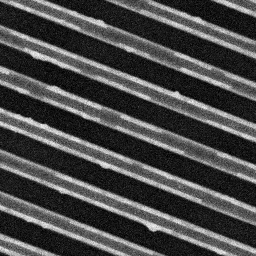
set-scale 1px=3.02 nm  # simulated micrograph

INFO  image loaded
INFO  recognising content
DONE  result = parallel lines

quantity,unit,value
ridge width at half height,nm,46.7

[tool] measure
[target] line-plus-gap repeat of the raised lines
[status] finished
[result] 118 nm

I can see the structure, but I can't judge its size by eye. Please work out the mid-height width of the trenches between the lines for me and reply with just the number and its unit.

69.6 nanometers